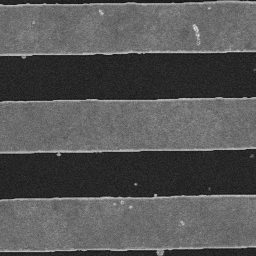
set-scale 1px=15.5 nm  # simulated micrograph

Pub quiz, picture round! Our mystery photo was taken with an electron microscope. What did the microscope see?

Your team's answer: lines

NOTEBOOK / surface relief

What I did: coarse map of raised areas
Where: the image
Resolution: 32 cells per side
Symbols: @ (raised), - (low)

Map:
-----------@@@@@@@@@@@@@@@@@@@@@
@@@@@@@@@@@@@@@@@@@@@@@@@@@@@@@@
@@@@@@@@@@@@@@@@@@@@@@@@@@@@@@@@
@@@@@@@@@@@@@@@@@@@@@@@@@@@@@@@@
@@@@@@@@@@@@@@@@@@@@@@@@@@@@@@@@
@@@@@@@@@@@@@@@@@@@@@@@@@@@@@@@@
@@@@@@@@@@@@@@@@@@@@@@@@@@@-----
--------------------------------
--------------------------------
--------------------------------
--------------------------------
--------------------------------
-----------@--------@@@@@@@@@@@@
@@@@@@@@@@@@@@@@@@@@@@@@@@@@@@@@
@@@@@@@@@@@@@@@@@@@@@@@@@@@@@@@@
@@@@@@@@@@@@@@@@@@@@@@@@@@@@@@@@
@@@@@@@@@@@@@@@@@@@@@@@@@@@@@@@@
@@@@@@@@@@@@@@@@@@@@@@@@@@@@@@@@
@@@@@@@@@@@@@@@@@@@@@@@@@@@@@@@@
--------------------------------
--------------------------------
--------------------------------
--------------------------------
--------------------------------
-------------------------@-@@@@@
@@@@@@@@@@@@@@@@@@@@@@@@@@@@@@@@
@@@@@@@@@@@@@@@@@@@@@@@@@@@@@@@@
@@@@@@@@@@@@@@@@@@@@@@@@@@@@@@@@
@@@@@@@@@@@@@@@@@@@@@@@@@@@@@@@@
@@@@@@@@@@@@@@@@@@@@@@@@@@@@@@@@
@@@@@@@@@@@@@@@@@@@@@@@@@@@@@@@@
--------------------------------